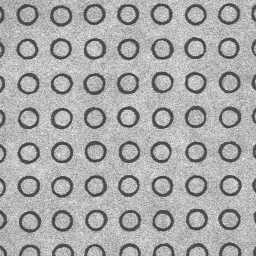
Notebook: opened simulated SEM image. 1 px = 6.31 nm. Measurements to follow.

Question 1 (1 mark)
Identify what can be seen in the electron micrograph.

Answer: a regular array of ring-shaped grooves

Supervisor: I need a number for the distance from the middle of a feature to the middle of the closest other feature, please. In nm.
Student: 220